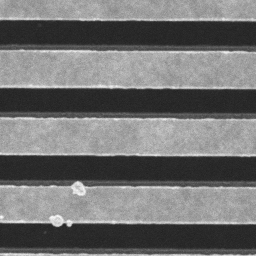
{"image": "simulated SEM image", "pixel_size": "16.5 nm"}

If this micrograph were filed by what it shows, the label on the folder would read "lines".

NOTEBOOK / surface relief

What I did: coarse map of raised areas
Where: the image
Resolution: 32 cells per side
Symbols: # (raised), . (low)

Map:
################################
################################
..........######################
................................
................................
................................
################################
################################
################################
################################
################################
................................
................................
................................
################################
################################
################################
################################
################################
..............................#.
................................
................................
................................
################################
################################
################################
################################
################################
................................
................................
................................
################################